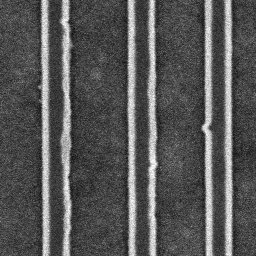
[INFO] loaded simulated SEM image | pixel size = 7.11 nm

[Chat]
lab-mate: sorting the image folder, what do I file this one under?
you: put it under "one or a few lines or trenches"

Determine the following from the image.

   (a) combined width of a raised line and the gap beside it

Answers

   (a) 0.578 um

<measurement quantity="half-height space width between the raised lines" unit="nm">426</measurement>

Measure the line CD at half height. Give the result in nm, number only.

147